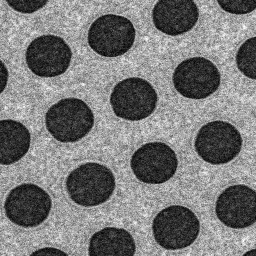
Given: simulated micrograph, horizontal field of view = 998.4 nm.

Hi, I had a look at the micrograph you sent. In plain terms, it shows a regular array of holes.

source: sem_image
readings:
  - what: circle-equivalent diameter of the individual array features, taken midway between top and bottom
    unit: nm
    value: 181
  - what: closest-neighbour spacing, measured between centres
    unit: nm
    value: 258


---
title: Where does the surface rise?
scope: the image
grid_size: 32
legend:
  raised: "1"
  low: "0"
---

10000011111111111110000001100000
11001111111111111110000001110001
11111111111100001110000001111111
11111111111000000111000011111111
11111001111000000111101111111111
11110000111000000111111111111100
11100000011100001111111111111100
11100000011111111111111000111000
01110000111111111111110000011100
01111001111111111111110000001110
01111111111111100001110000011111
11111111111111000000110000011111
11111110001111000000111111111111
11111100000111000000111111111111
11111100000011100001111111111111
00011100000011111111111111000111
00001100000111111111111110000011
00001110001111111111111100000011
00001111111111111000011100000011
00011111111111110000001110000011
01111111110001110000001111001111
11111111100000111000001111111111
11111111000000111000011111111111
11000111000000111111111111110000
10000011000000111111111111100000
00000001110001111111111111100000
00000011111111111111000011100000
10000011111111111110000001100000
11101111111110011110000001111001
11111111111000000110000001111111
11111111111000000111000011111111
11110000111000000111111111111110